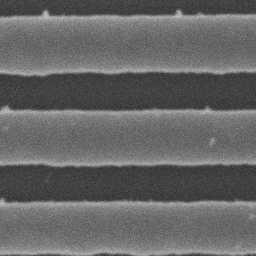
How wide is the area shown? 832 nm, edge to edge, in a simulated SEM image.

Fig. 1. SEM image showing lines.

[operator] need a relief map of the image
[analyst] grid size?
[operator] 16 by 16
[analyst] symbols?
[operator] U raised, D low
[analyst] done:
DDDDDDDDDDDDDDDD
UUUUUUUUUUUUUUUU
UUUUUUUUUUUUUUUU
UUUUUUUUUUUUUUUU
UUUUUUUUUUUUUUUU
DDDDDDDDDDDDDDDD
DDDDDDDDDDDDDDDD
UUUUUUUUUUUUUUUU
UUUUUUUUUUUUUUUU
UUUUUUUUUUUUUUUU
DDDDDDDDDDDDDDDD
DDDDDDDDDDDDDDDD
DDDDDDDDDDDDDDDD
UUUUUUUUUUUUUUUU
UUUUUUUUUUUUUUUU
UUUUUUUUUUUUUUUU